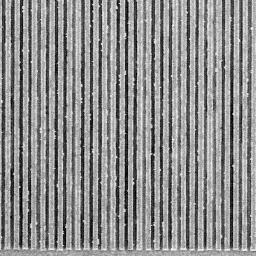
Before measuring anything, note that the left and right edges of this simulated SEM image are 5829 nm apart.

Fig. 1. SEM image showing parallel lines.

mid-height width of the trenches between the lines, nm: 79.7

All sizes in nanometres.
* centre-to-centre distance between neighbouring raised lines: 200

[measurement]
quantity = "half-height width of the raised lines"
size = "117 nm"